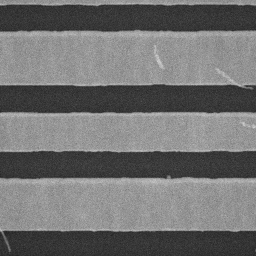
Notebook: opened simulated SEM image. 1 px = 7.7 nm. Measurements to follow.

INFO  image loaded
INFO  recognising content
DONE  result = lines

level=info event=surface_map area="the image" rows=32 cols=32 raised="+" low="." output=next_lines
+....+++..+++.......++.+.....+++
................................
................................
................................
++++++++++++++++++++++++++++++++
++++++++++++++++++++++++++++++++
++++++++++++++++++++++++++++++++
++++++++++++++++++++++++++++++++
++++++++++++++++++++++++++++++++
++++++++++++++++++++++++++++++++
+++++++++++++++++++.++++++++++++
................................
................................
................................
++++++++++++++++++++++++++++++++
++++++++++++++++++++++++++++++++
++++++++++++++++++++++++++++++++
++++++++++++++++++++++++++++++++
++++++++++++++++++++++++++++++++
................................
................................
................................
++++++++++++++++++++++++++++++++
++++++++++++++++++++++++++++++++
++++++++++++++++++++++++++++++++
++++++++++++++++++++++++++++++++
++++++++++++++++++++++++++++++++
++++++++++++++++++++++++++++++++
++++++++++++++++++++++++++++++++
................................
................................
................................